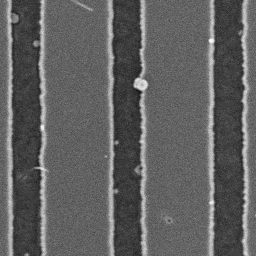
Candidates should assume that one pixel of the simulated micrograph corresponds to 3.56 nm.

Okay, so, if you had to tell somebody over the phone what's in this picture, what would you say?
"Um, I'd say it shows lines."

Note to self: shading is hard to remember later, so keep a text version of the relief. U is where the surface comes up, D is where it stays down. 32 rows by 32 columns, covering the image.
UDDDDUUUUUUUUUDDDDUUUUUUUUUDDDUU
UDDDDUUUUUUUUUDDDDUUUUUUUUUDDDUU
UDDDDUUUUUUUUUDDDDUUUUUUUUUDDDUU
UDDDDUUUUUUUUUDDDDUUUUUUUUUDDDUU
UDDDDUUUUUUUUUDDDDUUUUUUUUUDDDUU
UDDDDUUUUUUUUUDDDDUUUUUUUUUDDDUU
UDDDDUUUUUUUUUDDDUUUUUUUUUUDDDUU
UDDDDUUUUUUUUUDDDDUUUUUUUUUDDDUU
UDDDDUUUUUUUUUDDDDUUUUUUUUUDDDUU
UDDDDUUUUUUUUUDDDUUUUUUUUUUDDDUU
UDDDDUUUUUUUUUDDDUUUUUUUUUUDDDUU
UDDDDUUUUUUUUUDDDDUUUUUUUUUDDDDU
UDDDDUUUUUUUUUDDDDUUUUUUUUUDDDUU
UDDDDUUUUUUUUUDDDDUUUUUUUUUDDDDU
UDDDDUUUUUUUUUDDDDUUUUUUUUUDDDUU
UDDDDUUUUUUUUUDDDDUUUUUUUUUDDDUU
UDDDDUUUUUUUUUDDDDUUUUUUUUUDDDUU
UDDDDUUUUUUUUUDDDDUUUUUUUUUDDDDU
UDDDDUUUUUUUUUDDDDUUUUUUUUUDDDUU
UDDDDUUUUUUUUUDDDDUUUUUUUUUDDDUU
UDDDDUUUUUUUUUDDDDUUUUUUUUUDDDUU
UDDDDUUUUUUUUUDDDDUUUUUUUUUDDDDU
UDDDDUUUUUUUUUDDDDUUUUUUUUUDDDDU
UDDDDUUUUUUUUUDDDDUUUUUUUUUDDDDU
UDDDDUUUUUUUUUDDDDUUUUUUUUUDDDDU
UDDDDUUUUUUUUUDDDDUUUUUUUUUDDDDU
UUDDDUUUUUUUUUDDDDUUUUUUUUUDDDDU
UUDDDUUUUUUUUUDDDDUUUUUUUUUDDDUU
UUDDDUUUUUUUUUDDDDUUUUUUUUUDDDUU
UUDDDUUUUUUUUUDDDDUUUUUUUUUDDDUU
UUDDDUUUUUUUUUDDDDUUUUUUUUUDDDUU
UUDDDUUUUUUUUUDDDDUUUUUUUUUDDDDU